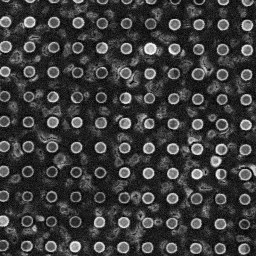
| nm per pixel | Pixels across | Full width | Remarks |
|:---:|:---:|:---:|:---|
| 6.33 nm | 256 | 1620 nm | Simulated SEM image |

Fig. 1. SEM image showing a regular array of raised bodies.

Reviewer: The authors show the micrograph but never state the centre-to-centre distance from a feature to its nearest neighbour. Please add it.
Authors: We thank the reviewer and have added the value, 152 nanometers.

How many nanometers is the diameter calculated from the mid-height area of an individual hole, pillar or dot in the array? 66.3